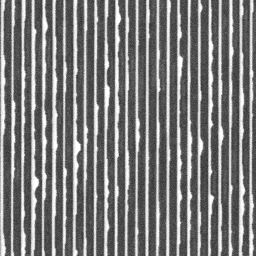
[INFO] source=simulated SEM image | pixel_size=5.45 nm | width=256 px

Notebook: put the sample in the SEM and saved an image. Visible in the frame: parallel lines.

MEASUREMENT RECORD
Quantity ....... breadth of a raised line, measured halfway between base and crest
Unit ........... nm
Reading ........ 15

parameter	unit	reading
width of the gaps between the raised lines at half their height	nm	44.3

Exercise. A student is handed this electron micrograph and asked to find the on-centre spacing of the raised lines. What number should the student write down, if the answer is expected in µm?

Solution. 0.0565